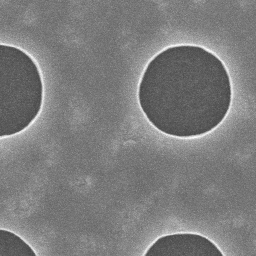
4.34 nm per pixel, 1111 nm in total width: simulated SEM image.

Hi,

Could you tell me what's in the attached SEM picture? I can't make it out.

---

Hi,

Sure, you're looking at holes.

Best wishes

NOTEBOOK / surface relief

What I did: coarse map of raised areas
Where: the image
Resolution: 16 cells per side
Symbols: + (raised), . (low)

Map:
++++++++++++++++
++++++++++++++++
++++++++++++++++
..++++++++...+++
..+++++++.....++
...++++++.....++
...++++++.....++
..+++++++.....++
+++++++++++.++++
++++++++++++++++
++++++++++++++++
++++++++++++++++
++++++++++++++++
++++++++++++++++
.+++++++++++++++
..+++++++.....++